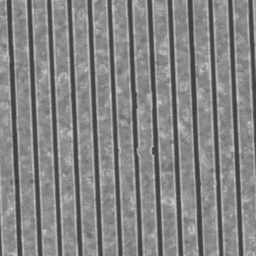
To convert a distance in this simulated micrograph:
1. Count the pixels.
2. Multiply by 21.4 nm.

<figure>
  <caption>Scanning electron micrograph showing parallel lines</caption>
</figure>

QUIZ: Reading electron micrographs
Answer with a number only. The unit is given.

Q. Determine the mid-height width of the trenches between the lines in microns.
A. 0.12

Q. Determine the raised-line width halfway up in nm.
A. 302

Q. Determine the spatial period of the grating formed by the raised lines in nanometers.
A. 431